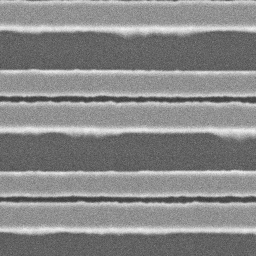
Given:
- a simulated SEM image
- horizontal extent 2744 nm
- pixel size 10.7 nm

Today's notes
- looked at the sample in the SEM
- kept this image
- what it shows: lines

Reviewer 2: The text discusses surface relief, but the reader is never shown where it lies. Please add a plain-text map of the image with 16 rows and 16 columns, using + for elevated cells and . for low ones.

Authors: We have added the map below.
++++++++++++++++
++++++++++++++++
................
................
++++++++++++++++
++++++++++++++++
++++++++++++++++
++++++++++++++++
................
................
................
++++++++++++++++
++++++++++++++++
++++++++++++++++
................
................